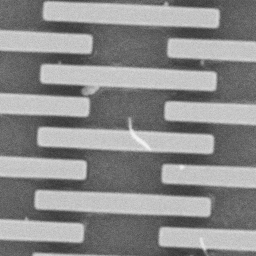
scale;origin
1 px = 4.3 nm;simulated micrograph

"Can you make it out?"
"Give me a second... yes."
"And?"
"groups of lines, slits or small figures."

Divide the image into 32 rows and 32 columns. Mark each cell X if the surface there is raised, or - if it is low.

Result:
------XXXXXXXX------------------
------XXXXXXXXXXXXXXXXXXXXX-----
------XXXXXXXXXXXXXXXXXXXXX-----
--------------------------------
XXXXXXXXXXX---------------------
XXXXXXXXXXX----------XXXXXXXXXXX
------XXXXX----------XXXXXXXXXXX
------------------------------XX
-----XXXXXXXXXXX----------------
-----XXXXXXXXXXXXXXXXXXXXXX-----
---------XXXXXXXXXXXXXXXXXX-----
--------------------------------
XXXXXXXXXXX---------------------
XXXXXXXXXXX----------XXXXXXXXXXX
--------XXX----------XXXXXXXXXXX
--------------------------------
-----XXXXXXXXXXXXX--------------
-----XXXXXXXXXXXXXXXXXXXXXX-----
-----------XXXXXXXXXXXXXXXX-----
--------------------------------
XXXXXXXXXXX---------------------
XXXXXXXXXXX---------XXXXXXXXXXXX
--------------------XXXXXXXXXXXX
--------------------------------
----XXXXXXXXXXXXXXXX------------
----XXXXXXXXXXXXXXXXXXXXXX------
-------------XXXXXXXXXXXXX------
X-------------------------------
XXXXXXXXXX----------XX----------
XXXXXXXXXX----------XXXXXXXXXXXX
--------------------XXXXXXXXXXXX
--------------------------------